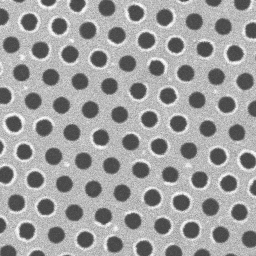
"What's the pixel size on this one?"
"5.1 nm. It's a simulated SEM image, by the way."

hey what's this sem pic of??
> a regular array of holes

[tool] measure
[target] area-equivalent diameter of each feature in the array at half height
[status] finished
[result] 0.0857 um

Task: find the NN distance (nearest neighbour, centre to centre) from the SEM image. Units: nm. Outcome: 148